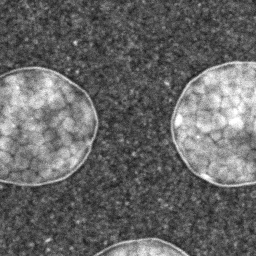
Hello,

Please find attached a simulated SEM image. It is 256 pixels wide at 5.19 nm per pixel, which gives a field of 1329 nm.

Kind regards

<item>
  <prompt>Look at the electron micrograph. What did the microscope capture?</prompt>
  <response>holes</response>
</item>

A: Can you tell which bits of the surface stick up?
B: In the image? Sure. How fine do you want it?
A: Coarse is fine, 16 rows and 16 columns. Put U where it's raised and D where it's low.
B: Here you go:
UUUUUUUUUUUUUUUU
UUUUUUUUUUUUUUUU
UUUUUUUUUUUUUUUU
UUUUUUUUUUUUUUUU
UDDUUUUUUUUUUDDD
DDDDDUUUUUUUDDDD
DDDDDDUUUUUDDDDD
DDDDDDUUUUUDDDDD
DDDDDDUUUUUDDDDD
DDDDDDUUUUUDDDDD
DDDDDUUUUUUUDDDD
UDDUUUUUUUUUUUDU
UUUUUUUUUUUUUUUU
UUUUUUUUUUUUUUUU
UUUUUUUUUUUUUUUU
UUUUUUUDDDDUUUUU